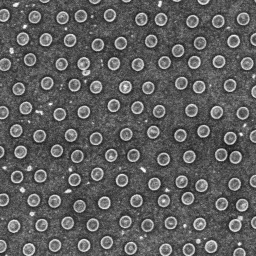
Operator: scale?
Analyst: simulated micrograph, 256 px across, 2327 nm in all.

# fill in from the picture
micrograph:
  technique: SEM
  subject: a regular array of raised bodies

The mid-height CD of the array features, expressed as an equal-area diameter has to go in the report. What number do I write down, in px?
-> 12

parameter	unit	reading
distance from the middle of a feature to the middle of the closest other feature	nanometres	201